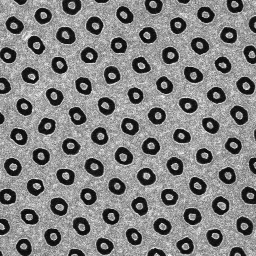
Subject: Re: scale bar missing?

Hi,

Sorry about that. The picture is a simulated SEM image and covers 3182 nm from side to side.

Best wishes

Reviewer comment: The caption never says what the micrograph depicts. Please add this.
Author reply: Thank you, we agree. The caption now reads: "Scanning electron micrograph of a regular array of ring-shaped grooves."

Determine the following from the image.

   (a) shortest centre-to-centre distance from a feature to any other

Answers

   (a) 371 nm